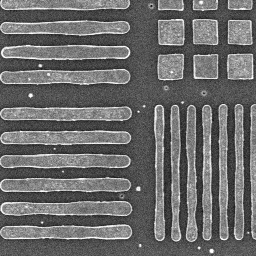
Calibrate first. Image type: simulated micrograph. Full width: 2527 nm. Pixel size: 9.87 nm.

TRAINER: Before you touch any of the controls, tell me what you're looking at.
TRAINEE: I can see groups of lines, slits or small figures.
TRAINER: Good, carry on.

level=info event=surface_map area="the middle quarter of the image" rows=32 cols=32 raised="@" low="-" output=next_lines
------------------------@@@@@@--
------------------------@@@@@@--
@@@@@@@@@@@@@@@@--------@@@@@@--
@@@@@@@@@@@@@@@@--------@@@@@---
-@@@@@@@@@-@@@@@----------------
--------------------------------
--------------------------------
--------------------------------
--------------------------------
--------------------------------
-----------------------@---@----
@@@@@@@@@@@@@@@@@------@@--@@--@
@@@@@@@@@@@@@@@@@------@@--@@--@
@@@@@@@@@@@@@@@@-------@@--@@--@
-----------------------@@--@@--@
-----------------------@@--@@--@
-----------------------@@--@@--@
@@@@@@@@@@@@@@@@-------@@--@@--@
@@@@@@@@@@@@@@@@@------@@--@@--@
@@@@@@@@@@@@@@@@-------@@--@@--@
-----------------------@@--@@--@
-----------------------@@--@@--@
-----------------------@@--@@--@
@@@@@@@@@@@@@@@@-------@@--@@--@
@@@@@@@@@@@@@@@@-------@@--@@--@
@@@@@@@@@@@@@@@@-------@@--@@--@
-----------------------@@--@@--@
-----------------------@@--@@--@
-----------------------@@--@@--@
@@@@@@@@@@@@@@@@-------@@--@@--@
@@@@@@@@@@@@@@@@@------@@--@@--@
@@@@@@@@@@@@@@@@-------@@--@@--@